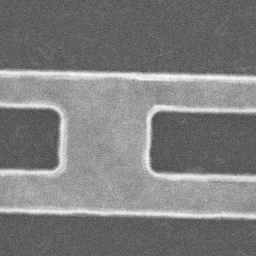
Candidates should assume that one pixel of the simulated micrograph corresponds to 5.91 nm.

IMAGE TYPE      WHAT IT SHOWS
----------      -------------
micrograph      one or a few lines or trenches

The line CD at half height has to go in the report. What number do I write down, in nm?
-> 231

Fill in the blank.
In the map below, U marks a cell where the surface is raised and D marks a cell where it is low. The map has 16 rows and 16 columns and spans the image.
DDDDDDDDDDDDDDDD
DDDDDDDDDDDDDDDD
DDDDDDDDDDDDDDDD
DDDDDDDDDDDDDDDD
DDDDDDDDDDDDDDDD
UUUUUUUUUUUUUUUU
UUUUUUUUUUUUUUUU
DDDDUUUUUDDDDDDD
DDDDUUUUUDDDDDDD
DDDDUUUUUDDDDDDD
DDDUUUUUUDDDDDDD
UUUUUUUUUUUUUUUU
UUUUUUUUUUUUUUUU
DDDDDDDDDDDDUUDU
DDDDDDDDDDDDDDDD
DDDDDDDDDDDDDDDD